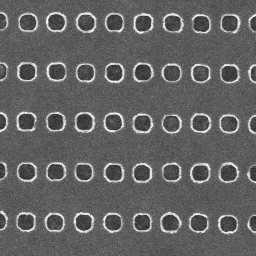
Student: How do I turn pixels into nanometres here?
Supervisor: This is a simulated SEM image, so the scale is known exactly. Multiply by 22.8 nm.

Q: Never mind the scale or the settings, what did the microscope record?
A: a regular array of holes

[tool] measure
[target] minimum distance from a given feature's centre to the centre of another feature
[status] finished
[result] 652 nanometers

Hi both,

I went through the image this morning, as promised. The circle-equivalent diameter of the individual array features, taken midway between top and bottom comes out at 0.389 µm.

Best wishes